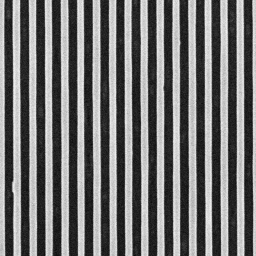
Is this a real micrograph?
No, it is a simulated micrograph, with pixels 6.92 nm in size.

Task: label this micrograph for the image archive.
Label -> parallel lines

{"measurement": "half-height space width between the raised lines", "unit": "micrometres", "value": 0.0632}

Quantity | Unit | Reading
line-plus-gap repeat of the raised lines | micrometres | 0.111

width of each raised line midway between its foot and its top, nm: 50.2